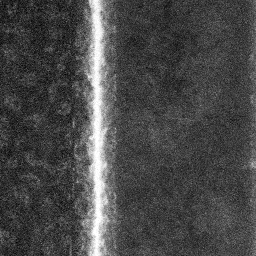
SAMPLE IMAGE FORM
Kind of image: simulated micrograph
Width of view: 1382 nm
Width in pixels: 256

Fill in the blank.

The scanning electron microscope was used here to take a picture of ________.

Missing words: one or a few lines or trenches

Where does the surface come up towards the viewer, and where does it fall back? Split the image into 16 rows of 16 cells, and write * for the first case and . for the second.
......**********
......**********
......**********
......**********
......**********
......**********
......**********
......**********
......**********
......**********
......**********
......**********
......**********
......**********
......**********
......**********